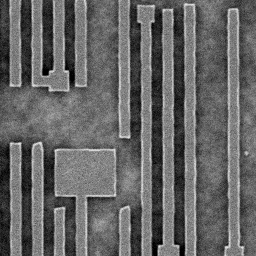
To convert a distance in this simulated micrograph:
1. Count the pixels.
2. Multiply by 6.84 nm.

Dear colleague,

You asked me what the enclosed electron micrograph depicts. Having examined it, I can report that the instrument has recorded wiring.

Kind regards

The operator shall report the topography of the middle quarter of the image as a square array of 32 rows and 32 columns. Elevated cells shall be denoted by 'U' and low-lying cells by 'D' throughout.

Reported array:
DDDUUUDDDDDDDDUUDDDUUUDDDUUDDDUU
DDDUUUDDDDDDDDUUDDDUUUDDDUUDDDUU
UDDUUUDDDDDDDDUUDDDUUUDDDUUDDDUU
UDDUUUDDDDDDDDUUDDDUUUDDDUUDDDUU
UDDUUUDDDDDDDDUUDDDUUUDDDUUDDDUU
UDDUUUDDDDDDDDUUDDDUUUDDDUUDDDUU
UDDDDDDDDDDDDDUUDDDDUUDDDUUDDDUU
DDDDDDDDDDDDDDUUDDDUUUDDDUUDDDUU
DDDDDDDDDDDDDDUUDDDUUUDDDUUDDDUU
DDDDDDDDDDDDDDUUDDDUUUDDDUUDDDUU
DDDDDDDDDDDDDDUUDDDDUUDDDUUDDDUU
DDDDDDDDDDDDDDUUDDDUUUDDDUUDDDUU
DDDDDDDDDDDDDDUUDDDUUUDDDUUDDDUU
DDDDDDDDDDDDDDUUDDDUUUDDDUUDDDUU
DDDDDDDDDDDDDDUUDDDDUUDDDUUDDDUU
DDDDDDDDDDDDDDUUDDDDUUDDDUUDDDUU
DDDDDDDDDDDDDDUUDDDDUUDDDUUDDDUU
DDDDDDDDDDDDDDUUDDDUUUDDDUUDDDUU
DDDDDDDDDDDDDDDDDDDUUUDDDUUDDDUU
DDDDDDDDDDDDDDDDDDDUUUDDDUUDDDUU
DDDDDDDDDDDDDDDDDDDDUUDDDUUDDDUU
UUUUUUUDDUUUDDDDDDDDUUDDDUUDDDUU
UUUUUUUUUUUUUDDDDDDDUUDDDUUDDDUU
UUUUUUUUUUUUUDDDDDDDUUDDDUUDDDUU
UUUUUUUUUUUUUDDDDDDDUUDDDUUDDDUU
UUUUUUUUUUUUUDDDDDDDUUDDDUUDDDDU
UUUUUUUUUUUUUDDDDDDDUUDDDUUDDDUU
UUUUUUUUUUUUUDDDDDDDUUDDDUUDDDUU
UUUUUUUUUUUUUDDDDDDDUUDDDUUDDDUU
UUUUUUUUUUUUUDDDDDDDUUDDDUUDDDUU
UUUUUUUUUUUUUDDDDDDDUUDDDUUDDDUU
UUUUUUUUUUUUUDDDDDDUUUDDDUUDDDUU